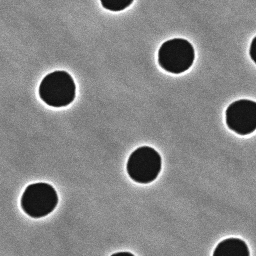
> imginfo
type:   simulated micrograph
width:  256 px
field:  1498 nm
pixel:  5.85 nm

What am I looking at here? holes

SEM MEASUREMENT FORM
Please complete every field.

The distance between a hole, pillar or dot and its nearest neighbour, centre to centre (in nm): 652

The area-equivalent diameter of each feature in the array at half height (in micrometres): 0.211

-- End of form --